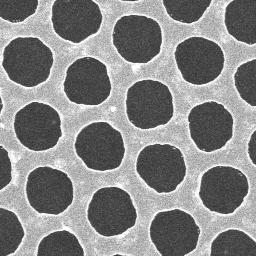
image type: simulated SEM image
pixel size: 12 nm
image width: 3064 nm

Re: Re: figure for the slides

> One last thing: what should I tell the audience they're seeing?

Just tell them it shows a regular array of holes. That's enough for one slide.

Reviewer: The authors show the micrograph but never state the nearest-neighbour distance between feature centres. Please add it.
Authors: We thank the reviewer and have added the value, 772 nm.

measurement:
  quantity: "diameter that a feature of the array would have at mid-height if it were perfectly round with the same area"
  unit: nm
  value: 588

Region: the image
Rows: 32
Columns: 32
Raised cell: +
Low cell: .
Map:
.....++.....++++++++......+++...
....++.......++++++++.....++....
+..+++.......++....+++...+++....
+++++++.....++......++++++++....
+++++++....+++......+++++++++...
+.....++++++++......++.....++++.
......+++++++++.....++......++++
.......+++..++++...+++......++++
......+++....+++++++++......++..
+.....++......+++++++++....++...
++...+++......+++...++++..+++...
++++++++......++.....+++++++++..
+++++++++....+++......++++++++..
+++....+++++++++......++....++++
++.....+++++++++......++.....+++
++......+++...+++....+++.....+++
++......++.....+++++++++.....+++
++.....++......+++++++++.....++.
.++...+++.......++....+++...+++.
.+++++++++.....++......++++++++.
.++++++++++....++......+++++++++
.+++....+++++++++......+++....++
.++......+++++++++.....++......+
+++......++++..++++...+++......+
+++......+++....+++++++++......+
++++.....++......++++++++.....++
..+++...+++......+++...++++..+++
..+++++++++......++.....++++++++
...+++++++++....+++......+++++++
...+++...++++.+++++......++....+
...++.....+++++++++......+......
..+++.....++++++++++....++......